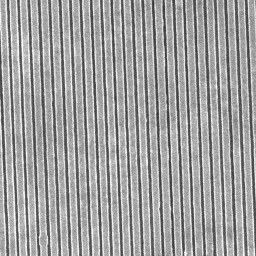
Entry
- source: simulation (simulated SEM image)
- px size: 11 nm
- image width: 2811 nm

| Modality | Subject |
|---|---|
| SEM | parallel lines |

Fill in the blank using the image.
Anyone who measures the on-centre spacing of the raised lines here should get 0.114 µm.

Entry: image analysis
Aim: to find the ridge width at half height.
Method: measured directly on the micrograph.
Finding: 76.8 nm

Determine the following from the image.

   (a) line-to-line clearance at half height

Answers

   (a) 38.4 nm